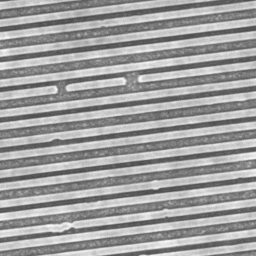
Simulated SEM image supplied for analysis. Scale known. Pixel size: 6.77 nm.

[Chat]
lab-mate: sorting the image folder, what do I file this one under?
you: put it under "parallel lines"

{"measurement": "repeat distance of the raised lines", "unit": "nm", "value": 101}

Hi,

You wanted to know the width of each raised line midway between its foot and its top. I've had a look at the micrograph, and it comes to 0.0504 µm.